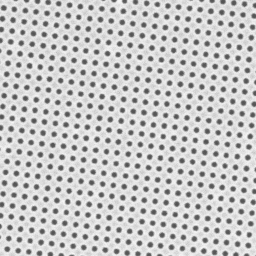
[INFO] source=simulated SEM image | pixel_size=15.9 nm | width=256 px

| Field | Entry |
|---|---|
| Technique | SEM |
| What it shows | a regular array of holes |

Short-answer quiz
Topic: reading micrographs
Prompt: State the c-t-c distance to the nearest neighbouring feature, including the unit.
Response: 169 nm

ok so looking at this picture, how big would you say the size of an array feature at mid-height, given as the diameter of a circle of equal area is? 106 nm